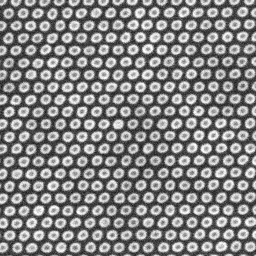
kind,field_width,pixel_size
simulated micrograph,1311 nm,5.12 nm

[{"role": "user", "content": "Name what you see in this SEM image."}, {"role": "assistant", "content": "a regular array of raised bodies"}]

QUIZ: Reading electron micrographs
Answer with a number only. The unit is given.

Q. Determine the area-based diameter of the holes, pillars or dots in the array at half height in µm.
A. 0.0469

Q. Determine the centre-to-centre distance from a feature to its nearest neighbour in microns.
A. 0.0708